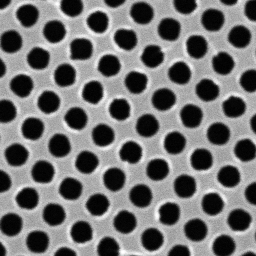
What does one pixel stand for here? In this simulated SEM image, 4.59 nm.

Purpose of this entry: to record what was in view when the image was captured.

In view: a regular array of holes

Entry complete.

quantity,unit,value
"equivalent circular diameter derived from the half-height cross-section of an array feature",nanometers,107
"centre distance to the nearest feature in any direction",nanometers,143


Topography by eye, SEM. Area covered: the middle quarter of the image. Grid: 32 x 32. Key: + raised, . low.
..++++++......++++++....+++....+
...+++++......++++++++++++......
...++++++....+++....++++++......
...++++++++++++......+++++......
...+++...++++++......++++++....+
..+++....++++++......+++++++++++
++++......++++++....+++....+++++
++++......++++++++.+++......++++
+++++.....++++++++++++......++++
++++++...+++....++++++......++++
+++++++++++......+++++.....+++..
+....++++++......+++++++..+++...
......+++++......+++.++++++++...
......++++++....+++....++++++...
......++++++++++++......+++++...
+....+++...+++++++......++++++..
++..+++.....++++++......++++++++
+++++++......++++++....+++...+++
.++++++......++++++++++++.....++
..+++++.....+++...+++++++......+
..+++++++..+++.....++++++.....++
..++++++++++++......+++++.....++
.+++....++++++......++++++..++++
+++.....++++++.....++++.+++++++.
+++......++++++....++.....++++++
+++......++++++++++++.....++++++
+++.....+++...+++++++.....++++++
+++++.++++.....++++++.....++++++
..++++++++.....++++++....+++....
....++++++.....+++++++++++++....
.....+++++.....+++...++++++.....
.....++++++...+++.....+++++.....